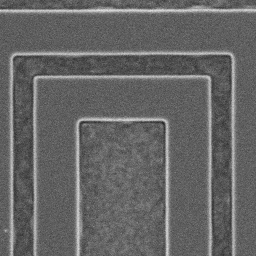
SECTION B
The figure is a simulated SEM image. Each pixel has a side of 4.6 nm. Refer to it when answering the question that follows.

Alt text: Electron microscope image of groups of lines, slits or small figures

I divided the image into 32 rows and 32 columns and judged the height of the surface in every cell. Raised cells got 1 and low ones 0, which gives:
00000000000000000000000000000000
11111111111111111111111111111111
11111111111111111111111111111111
11111111111111111111111111111111
11111111111111111111111111111111
11111111111111111111111111111111
11111111111111111111111111111111
11000000000000000000000000000111
11000000000000000000000000000111
11000000000000000000000111000111
11001111111111111111111111000111
11001111111111111111111111000111
11001111111111111111111111000111
11001111111111111111111111000111
11001111111111111111111111000111
11001111110000000000011111000111
11001111110000000000011111000111
11001111110000000000011111000111
11001111110000000000011111000111
11001111110000000000011111000111
11001111110000000000011111000111
11001111110000000000011111000111
11001111110000000000011111000111
11001111110000000000011111000111
11001111110000000000011111000111
11001111110000000000011111000111
11001111110000000000011111000111
11001111110000000000011111000111
11001111110000000000011111000111
11001111110000000000011111000111
11001111110000000000011111000111
11001111110000000000011111000111